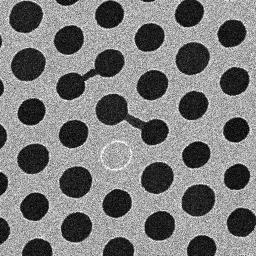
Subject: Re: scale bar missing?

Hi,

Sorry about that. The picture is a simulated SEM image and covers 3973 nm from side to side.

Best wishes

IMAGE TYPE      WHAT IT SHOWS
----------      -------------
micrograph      a regular array of holes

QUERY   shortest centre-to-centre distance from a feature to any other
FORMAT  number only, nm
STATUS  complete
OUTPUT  724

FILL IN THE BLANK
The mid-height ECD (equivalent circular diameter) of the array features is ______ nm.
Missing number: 462